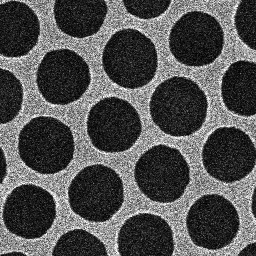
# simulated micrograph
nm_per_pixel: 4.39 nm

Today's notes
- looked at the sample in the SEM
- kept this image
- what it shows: a regular array of holes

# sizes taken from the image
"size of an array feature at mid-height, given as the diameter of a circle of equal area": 248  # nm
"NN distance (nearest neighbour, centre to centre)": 302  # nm